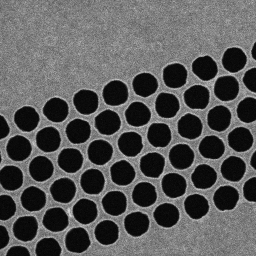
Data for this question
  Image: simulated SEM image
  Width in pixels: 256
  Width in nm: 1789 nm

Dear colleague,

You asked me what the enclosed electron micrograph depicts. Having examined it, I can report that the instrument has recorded a regular array of holes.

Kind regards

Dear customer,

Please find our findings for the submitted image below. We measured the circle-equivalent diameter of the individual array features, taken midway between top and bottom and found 0.175 um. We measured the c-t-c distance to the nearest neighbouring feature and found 210 nm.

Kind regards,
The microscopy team